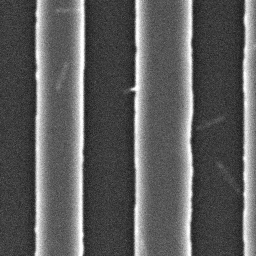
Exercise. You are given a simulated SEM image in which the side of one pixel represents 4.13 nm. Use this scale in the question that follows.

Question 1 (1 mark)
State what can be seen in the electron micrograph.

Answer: lines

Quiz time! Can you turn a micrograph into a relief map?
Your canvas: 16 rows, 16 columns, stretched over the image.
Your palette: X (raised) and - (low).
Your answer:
--XXX----XXX---X
--XXX----XXX---X
--XXX----XXX---X
--XXX----XXX---X
--XXX----XXX---X
--XXX---XXXX---X
--XXX---XXXX---X
--XXX---XXXX---X
--XXX---XXXX---X
--XXX---XXXX---X
--XXX---XXXX---X
--XXX----XXX---X
--XXX---XXXX---X
--XXX---XXXX---X
--XXX---XXXX---X
--XXX---XXXX---X